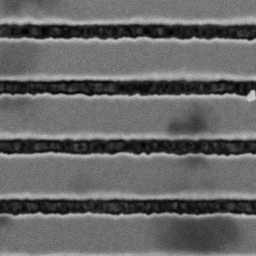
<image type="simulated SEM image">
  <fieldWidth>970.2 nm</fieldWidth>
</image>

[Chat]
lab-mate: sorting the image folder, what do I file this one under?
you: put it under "lines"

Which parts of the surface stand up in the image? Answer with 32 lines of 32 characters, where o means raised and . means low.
oooooooooooooooooooooooooooooooo
oooooooooooooooooooooooooooooooo
oooooooooooooooooooooooooooooooo
................................
................................
oooooooooooooooooooooooooooooooo
oooooooooooooooooooooooooooooooo
oooooooooooooooooooooooooooooooo
oooooooooooooooooooooooooooooooo
oooooooooooooooooooooooooooooooo
................................
...............................o
oooooooooooooooooooooooooooooooo
oooooooooooooooooooooooooooooooo
oooooooooooooooooooooooooooooooo
oooooooooooooooooooooooooooooooo
oooooooooooooooooooooooooooooooo
.........o......................
................................
oooooooooooooooooooooooooooooooo
oooooooooooooooooooooooooooooooo
oooooooooooooooooooooooooooooooo
oooooooooooooooooooooooooooooooo
oooooooooooooooooooooooooooooooo
oooooooooooooooooooooooooooooooo
................................
................................
oooooooooooooooooooooooooooooooo
oooooooooooooooooooooooooooooooo
oooooooooooooooooooooooooooooooo
oooooooooooooooooooooooooooooooo
oooooooooooooooooooooooooooooooo